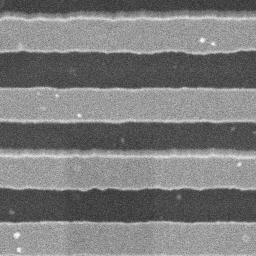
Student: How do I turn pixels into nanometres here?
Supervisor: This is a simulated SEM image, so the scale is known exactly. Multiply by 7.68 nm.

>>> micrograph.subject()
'lines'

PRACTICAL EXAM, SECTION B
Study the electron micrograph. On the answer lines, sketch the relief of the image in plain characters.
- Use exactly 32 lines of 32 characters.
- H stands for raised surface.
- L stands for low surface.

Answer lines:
LLLLLLLLLLLLLLLLLLLLLLLLLLLLLLLL
LLLLLLLLLLLLLLLLLLLLLLLLLLLLLLLL
HHHHHHHHHHHHHHHHHHHHHHHHHHHHHHHH
HHHHHHHHHHHHHHHHHHHHHHHHHHHHHHHH
HHHHHHHHHHHHHHHHHHHHHHHHHHHHHHHH
HHHHHHHHHHHHHHHHHHHHHHHHHHHHHHHH
LLLLLLLLLLLLLHLLHHHHLLLHHHHLHLLL
LLLLLLLLLLLLLLLLLLLLLLLLLLLLLLLL
LLLLLLLLLLLLLLLLLLLLLLLLLLLLLLLL
LLLLLLLLLLLLLLLLLLLLLLLLLLLLLLLL
LLLLLLLLLLLLLLLLLLLLLLLLLLLLLLLL
HHHHHHHHHHHHHHHHHHHHHHHHHHHHHHHH
HHHHHHHHHHHHHHHHHHHHHHHHHHHHHHHH
HHHHHHHHHHHHHHHHHHHHHHHHHHHHHHHH
HHHHHHHHHHHHHHHHHHHHHHHHHHHHHHHH
LLLLLLLLLLLLLLLLLLLLLLLLLLLLLLLL
LLLLLLLLLLLLLLLLLLLLLLLLLLLLLLLL
LLLLLLLLLLLLLLLLLLLLLLLLLLLLLLLL
LLLLLLLLLLLLLLLLLLLLLLLLLLLLLLLL
HHHHHHHHHHHHHHHHHHHHHHHHHHHHHHHH
HHHHHHHHHHHHHHHHHHHHHHHHHHHHHHHH
HHHHHHHHHHHHHHHHHHHHHHHHHHHHHHHH
HHHHHHHHHHHHHHHHHHHHHHHHHHHHHHHH
LHHLHHHHHHHHHHHHHHLLHHHLHHLLLLHH
LLLLLLLLLLLLLLLLLLLLLLLLLLLLLLLL
LLLLLLLLLLLLLLLLLLLLLLLLLLLLLLLL
LLLLLLLLLLLLLLLLLLLLLLLLLLLLLLLL
LLLLLLLLLLLLLLLLLLLLLLLLLLLLLLLL
HHHHHHHHHHHHHHHHHHHHHHHHHHHHHHHH
HHHHHHHHHHHHHHHHHHHHHHHHHHHHHHHH
HHHHHHHHHHHHHHHHHHHHHHHHHHHHHHHH
HHHHHHHHHHHHHHHHHHHHHHHHHHHHHHHH